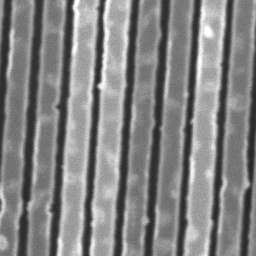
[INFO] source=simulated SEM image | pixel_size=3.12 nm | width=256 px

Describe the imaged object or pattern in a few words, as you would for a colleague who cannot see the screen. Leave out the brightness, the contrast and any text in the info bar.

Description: parallel lines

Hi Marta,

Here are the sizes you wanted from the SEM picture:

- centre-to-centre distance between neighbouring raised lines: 98.7 nm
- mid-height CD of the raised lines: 71.1 nm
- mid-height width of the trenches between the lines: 27.2 nm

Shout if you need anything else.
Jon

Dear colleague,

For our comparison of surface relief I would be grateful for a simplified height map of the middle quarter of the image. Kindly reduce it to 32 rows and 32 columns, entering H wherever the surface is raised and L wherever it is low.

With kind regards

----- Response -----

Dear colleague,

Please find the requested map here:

LLHHHHHHLLHHHHHLLLHHHHHLLLHHHHHL
LLHHHHHLLLHHHHHLLLHHHHHLLLHHHHHL
LLHHHHHLLHHHHHHLLLHHHHHLLHHHHHHL
LLHHHHHLLLHHHHHLLLHHHHHLLLHHHHHL
LLHHHHHLLHHHHHHLLLHHHHHLLHHHHHHL
LLHHHHHLLHHHHHHLLLHHHHHLLHHHHHHL
LHHHHHHLLHHHHHHLLHHHHHHLLHHHHHHL
LLHHHHHLLHHHHHHLLHHHHHHLLHHHHHHL
LHHHHHHLLHHHHHHLLHHHHHHLLHHHHHHL
LHHHHHHLLHHHHHHLLHHHHHHLLHHHHHHL
LHHHHHHLLHHHHHHLLHHHHHLLLHHHHHHL
LHHHHHHLLHHHHHHLLHHHHHLLLHHHHHHL
LHHHHHHLLHHHHHHLLHHHHHLLLHHHHHLL
LHHHHHHLLHHHHHHLLHHHHHLLLHHHHHLL
LHHHHHHLLHHHHHHLLHHHHHHLLHHHHHLL
LHHHHHHLLHHHHHHLLHHHHHHLHHHHHHLL
LHHHHHLLLHHHHHLLLHHHHHLLHHHHHHLL
LHHHHHLLLHHHHHLLLHHHHHLLHHHHHHLL
LHHHHHLLLHHHHHLLHHHHHHLLHHHHHHLL
HHHHHHLLHHHHHHLLHHHHHHLLHHHHHHLL
HHHHHHLLHHHHHHLLLHHHHHLLHHHHHHLL
HHHHHHLLHHHHHHLLHHHHHHLLHHHHHHLL
HHHHHHLLHHHHHHLLHHHHHHLLHHHHHHLL
HHHHHHLLHHHHHHLLHHHHHLLLHHHHHHLH
HHHHHHLLHHHHHHLLHHHHHLLLHHHHHHLL
HHHHHHLLHHHHHHLLHHHHHLLLHHHHHHLL
HHHHHHLLHHHHHHLLHHHHHLLLHHHHHHLL
HHHHHHLLHHHHHHLLHHHHHLLLHHHHHLLL
HHHHHLLLHHHHHHLLHHHHHLLLHHHHHLLH
HHHHHHLLHHHHHLLLHHHHHLLLHHHHHLLH
HHHHHHLLHHHHHHLLHHHHHLLLHHHHHLLH
HHHHHLLLHHHHHHLLHHHHHLLHHHHHHLLH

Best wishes